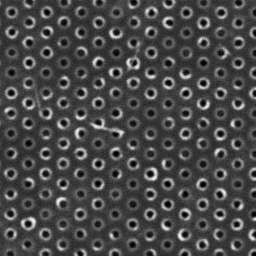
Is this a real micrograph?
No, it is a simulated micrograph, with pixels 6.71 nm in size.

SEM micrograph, a regular array of holes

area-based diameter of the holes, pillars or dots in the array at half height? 51.4 nm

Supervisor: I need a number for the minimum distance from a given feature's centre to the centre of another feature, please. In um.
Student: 0.133